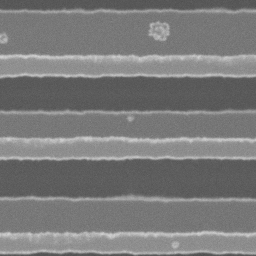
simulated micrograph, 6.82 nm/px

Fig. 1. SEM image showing lines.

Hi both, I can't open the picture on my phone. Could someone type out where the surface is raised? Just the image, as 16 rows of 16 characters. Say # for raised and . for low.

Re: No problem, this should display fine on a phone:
................
################
################
################
################
................
................
################
################
################
................
................
##########.#####
################
################
################